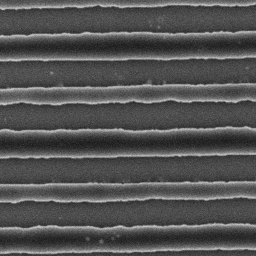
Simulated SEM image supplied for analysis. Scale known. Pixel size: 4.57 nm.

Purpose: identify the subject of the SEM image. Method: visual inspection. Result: lines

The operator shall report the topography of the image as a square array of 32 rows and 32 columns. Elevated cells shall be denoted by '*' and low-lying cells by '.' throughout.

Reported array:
********************************
................................
................................
................................
********************************
********************************
********************************
***..*..........................
................................
................................
................................
********************************
*********************.********.*
................................
................................
................................
********************************
********************************
********************************
***************.................
................................
................................
................................
********************************
********************************
................................
................................
................................
********************************
********************************
********************************
************..***...............